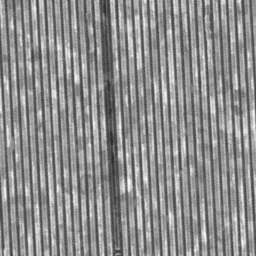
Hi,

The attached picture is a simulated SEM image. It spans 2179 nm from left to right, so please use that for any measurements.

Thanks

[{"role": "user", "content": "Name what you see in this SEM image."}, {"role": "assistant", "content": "parallel lines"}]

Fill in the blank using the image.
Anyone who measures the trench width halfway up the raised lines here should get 0.0308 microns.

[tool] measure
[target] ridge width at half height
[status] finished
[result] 36.1 nanometers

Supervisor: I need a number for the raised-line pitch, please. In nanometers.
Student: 67.1